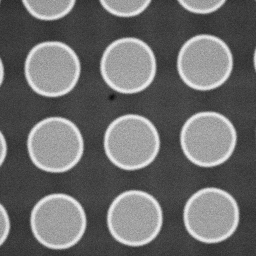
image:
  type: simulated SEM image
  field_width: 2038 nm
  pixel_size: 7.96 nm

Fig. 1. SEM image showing an array of small figures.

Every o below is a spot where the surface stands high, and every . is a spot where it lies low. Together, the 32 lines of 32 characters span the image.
...oooooo....oooooo....ooooo....
....ooooo.....oooo......oo......
................................
................................
.........................oo.....
.....ooo......oooo.....ooooo....
....ooooo....oooooo....oooooo...
...ooooooo...oooooo...ooooooo...
...ooooooo...oooooo...ooooooo...
...ooooooo...oooooo....oooooo...
....ooooo.....ooooo....ooooo....
.....oooo......oo...............
................................
................................
................o.......oooo....
.....oooo.....ooooo....oooooo...
....oooooo...ooooooo...oooooo...
o..ooooooo...ooooooo...oooooo...
o..ooooooo...ooooooo...oooooo...
o...oooooo...oooooo....oooooo...
....ooooo.....ooooo......oo.....
................................
................................
................................
......oo.......oooo.....ooooo...
.....ooooo....oooooo...oooooo...
o...oooooo....oooooo...ooooooo..
o...ooooooo..ooooooo...ooooooo..
o...ooooooo...oooooo...oooooo...
o...oooooo....ooooo.....ooooo...
.....oooo.......oo..............
................................